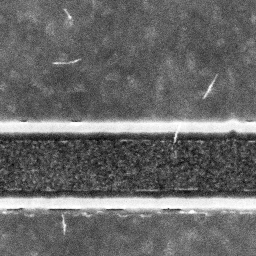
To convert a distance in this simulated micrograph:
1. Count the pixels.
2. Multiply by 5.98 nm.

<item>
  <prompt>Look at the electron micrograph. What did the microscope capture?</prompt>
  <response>one or a few lines or trenches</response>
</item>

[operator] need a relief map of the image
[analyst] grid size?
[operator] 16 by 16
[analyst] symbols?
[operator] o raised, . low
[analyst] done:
oooooooooooooooo
oooooooooooooooo
oooooooooooooooo
oooooooooooooooo
oooooooooooooooo
oooooooooooooooo
oooooooooooooooo
oooooooooooooooo
................
................
................
................
................
oooooooooooooooo
oooooooooooooooo
oooooooooooooooo